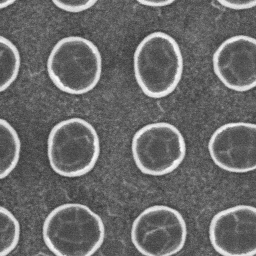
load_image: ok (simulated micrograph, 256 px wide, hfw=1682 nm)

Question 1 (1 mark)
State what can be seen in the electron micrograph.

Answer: raised bodies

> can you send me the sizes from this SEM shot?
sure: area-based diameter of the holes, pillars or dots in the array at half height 0.343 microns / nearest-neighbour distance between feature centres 544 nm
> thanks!